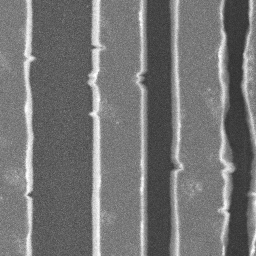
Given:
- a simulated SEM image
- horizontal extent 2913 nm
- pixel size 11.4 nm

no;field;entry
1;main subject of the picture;one or a few lines or trenches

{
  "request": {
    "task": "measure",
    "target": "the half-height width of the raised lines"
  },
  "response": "559 nm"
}